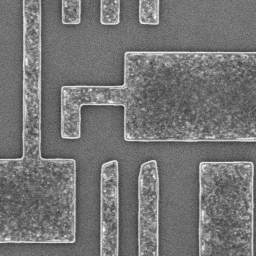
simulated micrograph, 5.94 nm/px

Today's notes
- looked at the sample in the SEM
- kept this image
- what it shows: wiring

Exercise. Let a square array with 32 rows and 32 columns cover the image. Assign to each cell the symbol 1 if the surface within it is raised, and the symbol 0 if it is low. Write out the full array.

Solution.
00011000110001100111000000000000
00011000110001100111000000000000
00011000110001100011000000000000
00011000000000000000000000000000
00011000000000000000000000000000
00011000000000000000000000000000
00011000000000000000000000000000
00011000000000001111111111111111
00011000000000001111111111111111
00011000000000001111111111111111
00011000000000011111111111111111
00011000111111111111111111111111
00011000111111111111111111111111
00011000110000011111111111111111
00011000110000001111111111111111
00011000110000001111111111111111
00011000110000001111111111111111
00011000000000001111111111111111
00011000000000000000000000000000
00011000000000000000000000000000
11111111100001100010000001111110
11111111100001100011000001111111
11111111100001100111000001111111
11111111100001100111000001111111
11111111100001100111000001111111
11111111100001100111000001111111
11111111100001100111000001111111
11111111100001100111000001111111
11111111100001100111000001111111
11111111100001100111000001111111
00000000000001100111000001111111
00000000000001100111000001111111